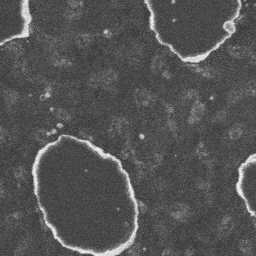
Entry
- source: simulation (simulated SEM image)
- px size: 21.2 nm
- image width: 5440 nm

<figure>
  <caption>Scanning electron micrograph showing raised bodies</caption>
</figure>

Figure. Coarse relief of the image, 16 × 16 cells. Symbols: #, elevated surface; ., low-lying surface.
##.......######.
##.......######.
#.........####..
...........##...
................
................
................
................
................
...###..........
..######.......#
..######.......#
..######.......#
...######.......
...#####........
....####........